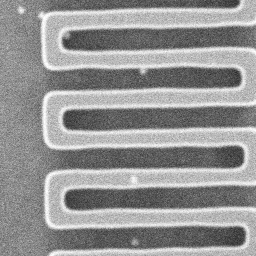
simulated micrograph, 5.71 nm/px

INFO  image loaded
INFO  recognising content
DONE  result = groups of lines, slits or small figures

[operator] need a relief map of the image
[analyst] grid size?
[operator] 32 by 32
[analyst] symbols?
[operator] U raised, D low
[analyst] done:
DDDDDDDDDDDDDDDDDDDDDDDDDDDDDDUU
DDDDDDDDDDDDUUUUUUUUUUUUUUUUUUUU
DDDDDUUUUUUUUUUUUUUUUUUUUUUUUUUU
DDDDDUUUUUUUUDDDDDDDDDDDDDDDDDDD
DDDDDUUUDDDDDDDDDDDDDDDDDDDDDDDD
DDDDDUUUDDDDDDDDDDDDDDDDDDDDDDDD
DDDDDUUUUUUDDUUUUUUUUUUUUUUUUUUU
DDDDDUUUUUUUUUUUUUUUUUUUUUUUUUUU
DDDDDDUUUDDDDDDDDDDDDDDDDDDDDDUU
DDDDDDDDDDDDDDDDDDDDDDDDDDDDDDUU
DDDDDDDDDDDDDDDDDDDDDDDDDDDDDDUU
DDDDDDDDDDDDDUUUUUUUUUUUUUUUUUUU
DDDDDDUUUUUUUUUUUUUUUUUUUUUUUUUU
DDDDDDUUUDDDDDDDDDDDDDDDDDDDDDDD
DDDDDDUUDDDDDDDDDDDDDDDDDDDDDDDD
DDDDDDUUDDDDDDDDDDDDDDDDDDDDDDDD
DDDDDDUUUUUDDUUUUUUUUUUUUUUUUUUU
DDDDDDUUUUUUUUUUUUUUUUUUUUUUUUUU
DDDDDDDUUUDDDDDDDDDDDDDDDDDDDDUU
DDDDDDDDDDDDDDDDDDDDDDDDDDDDDDDU
DDDDDDDDDDDDDDDDDDDDDDDDDDDDDDUU
DDDDDDDUUUUUUUUUUUUUUUUUUUUUUUUU
DDDDDDUUUUUUUUUUUUUUUUUUUUUUUUUU
DDDDDDUUUUDDDDDDDDDDDDDDDDDDDDDD
DDDDDDUUDDDDDDDDDDDDDDDDDDDDDDDD
DDDDDDUUDDDDDDDDDDDDDDDDDDDDDDDD
DDDDDDUUUUUUUUUUUUUUUUUUUUUUUUUU
DDDDDDUUUUUUUUUUUUUUUUUUUUUUUUUU
DDDDDDDDDDDDDDDDDDDDDDDDDDDDDDDU
DDDDDDDDDDDDDDDDDDDDDDDDDDDDDDDU
DDDDDDDDDDDDDDDDDDDDDDDDDDDDDDDU
DDDDDDDUUUUUUUUUUUUUUUUUUUUUUUUU